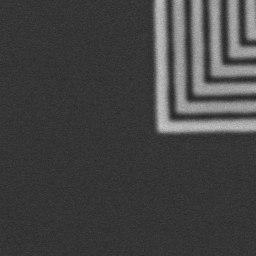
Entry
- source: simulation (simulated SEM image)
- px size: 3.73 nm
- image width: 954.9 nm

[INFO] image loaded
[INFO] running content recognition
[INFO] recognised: groups of lines, slits or small figures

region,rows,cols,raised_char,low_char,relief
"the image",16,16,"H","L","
LLLLLLLLLLHHHHHH
LLLLLLLLLLHHHHHH
LLLLLLLLLLHHHHHL
LLLLLLLLLLHHHHLH
LLLLLLLLLLHHHHHH
LLLLLLLLLLHHHHHH
LLLLLLLLLLLHHHHH
LLLLLLLLLLHLLLLH
LLLLLLLLLLLLLLLL
LLLLLLLLLLLLLLLL
LLLLLLLLLLLLLLLL
LLLLLLLLLLLLLLLL
LLLLLLLLLLLLLLLL
LLLLLLLLLLLLLLLL
LLLLLLLLLLLLLLLL
LLLLLLLLLLLLLLLL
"